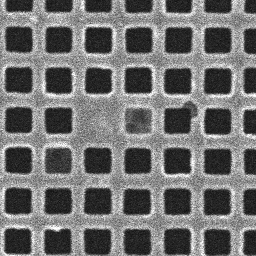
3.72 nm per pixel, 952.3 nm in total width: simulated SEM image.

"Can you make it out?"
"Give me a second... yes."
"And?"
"a regular array of holes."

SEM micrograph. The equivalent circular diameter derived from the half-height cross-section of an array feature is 109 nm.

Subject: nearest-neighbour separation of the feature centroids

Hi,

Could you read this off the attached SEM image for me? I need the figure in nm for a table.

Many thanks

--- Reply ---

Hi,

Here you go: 147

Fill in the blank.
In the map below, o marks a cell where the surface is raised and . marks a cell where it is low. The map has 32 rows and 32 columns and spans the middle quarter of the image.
oooooooooooooooooooooooooooooooo
..oooo......ooo.......oooo......
..ooo.......ooo.......ooo.......
..ooo.......ooo.......ooo.......
..ooo.......ooo.......ooo.......
..ooo.......ooo.......ooo.......
..ooo.......ooo.......ooo.......
oooooooooooooooo.....ooooo..o..o
oooooooooooooooooooooooooooooooo
oooooooooooooooooooooooooooooooo
oooooooooooooooooooooooooooooooo
..oooooooooooooooo..ooooo.......
..ooooooooooooooo....oooo.......
..ooooooooooooooo....oooo.......
..ooooooooooooooo....oooo.......
..oooooooooooooo...oooooo.......
..oooooooooooooo..ooooooo.......
.ooooooooooooooooooooooooo..o..o
oooooooooooooooooooooooooooooooo
oooooooooooooooooooooooooooooooo
oooooooooooooooooooooooooooooooo
..ooo.......ooo.......ooo......o
..ooo.......ooo.......ooo.......
..ooo.......ooo.......ooo.......
..ooo.......ooo.......ooo.......
..ooo.......ooo.......ooo.......
..ooo.......ooo.......ooo.......
.ooooo.....ooooo...ooooooo.....o
oooooooooooooooooooooooooooooooo
oooooooooooooooooooooooooooooooo
oooooooooooooooooooooooooooooooo
..ooo.......ooo......oooo......o